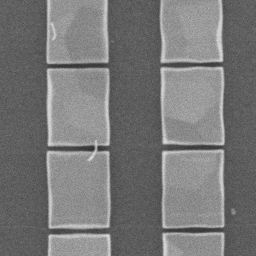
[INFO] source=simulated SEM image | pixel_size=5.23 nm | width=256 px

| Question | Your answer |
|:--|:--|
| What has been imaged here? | wiring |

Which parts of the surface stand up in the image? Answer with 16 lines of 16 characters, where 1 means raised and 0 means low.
0001111000111100
0001111000111100
0001111000111100
0001111000111100
0001111000111100
0001111000111100
0001111000111100
0001111000111100
0001111000111100
0001111000011100
0001111000111100
0001111000111100
0001111000111100
0001111000111100
0001000000111100
0001111000111100